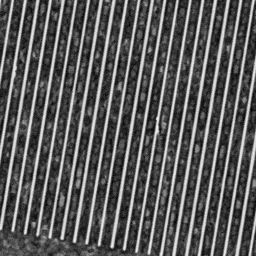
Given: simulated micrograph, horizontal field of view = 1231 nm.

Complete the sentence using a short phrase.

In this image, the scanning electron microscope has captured parallel lines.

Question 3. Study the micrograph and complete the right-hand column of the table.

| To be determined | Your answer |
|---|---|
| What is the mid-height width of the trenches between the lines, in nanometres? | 46.9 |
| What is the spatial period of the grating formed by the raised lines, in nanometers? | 60.1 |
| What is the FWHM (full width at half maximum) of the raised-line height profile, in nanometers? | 9.5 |